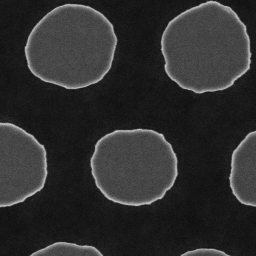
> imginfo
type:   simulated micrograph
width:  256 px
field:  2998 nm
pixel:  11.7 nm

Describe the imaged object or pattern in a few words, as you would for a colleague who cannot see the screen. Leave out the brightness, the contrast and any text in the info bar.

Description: raised bodies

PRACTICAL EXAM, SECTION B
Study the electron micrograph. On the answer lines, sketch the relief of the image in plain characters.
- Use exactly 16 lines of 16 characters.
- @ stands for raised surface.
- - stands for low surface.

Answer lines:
----@@------@@--
--@@@@@----@@@@-
--@@@@@---@@@@@@
--@@@@@---@@@@@@
--@@@@@---@@@@@-
----@-------@@--
----------------
----------------
@@-----@@@------
@@@---@@@@@----@
@@@---@@@@@---@@
@@@---@@@@@---@@
@------@@@-----@
----------------
----------------
---@@@----------